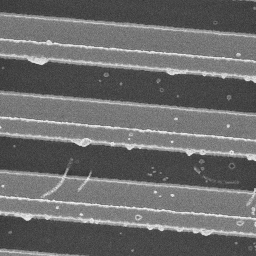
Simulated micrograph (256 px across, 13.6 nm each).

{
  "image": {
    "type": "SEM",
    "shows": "lines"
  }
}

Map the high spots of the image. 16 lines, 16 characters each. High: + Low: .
................
+++++++.........
++++++++++++++++
++++++++++++++++
..........++++++
................
++++++++........
++++++++++++++++
.+++++++++++++++
............++++
................
+++++++++.......
++++++++++++++++
.+++++++++++++++
............++++
................